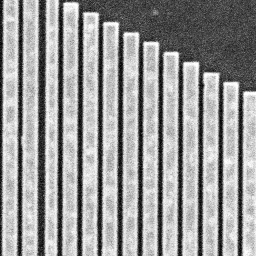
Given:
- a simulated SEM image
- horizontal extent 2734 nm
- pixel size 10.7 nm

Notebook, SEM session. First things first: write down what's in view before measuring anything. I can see parallel lines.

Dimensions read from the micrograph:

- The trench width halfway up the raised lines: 80.1 nm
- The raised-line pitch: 214 nanometres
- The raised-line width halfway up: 140 nm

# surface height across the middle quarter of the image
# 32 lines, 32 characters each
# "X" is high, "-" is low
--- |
XXX--XXX--XXX--XXX--XXX--XXX--XX
XXX--XXX--XXX--XXX--XXX--XXX--XX
XXX--XXX--XXX--XXX--XXX--XXX--XX
XXX--XXX--XXX--XXX--XXX--XXX--XX
XXX--XXX--XXX--XXX--XXX--XXX--XX
XXX--XXX--XXX--XXX--XXX--XXX--XX
XXX--XXX--XXX--XXX--XXX--XXX--XX
XXX--XXX--XXX--XXX--XXX--XXX--XX
XXX--XXX--XXX--XXX--XXX--XXX--XX
XXX--XXX--XXX--XXX--XXX--XXX--XX
XXX--XXX--XXX--XXX--XXX--XXX--XX
XXX--XXX--XXX--XXX--XXX--XXX--XX
XXX--XXX--XXX--XXX--XXX--XXX--XX
XXX--XXX--XXX--XXX--XXX--XXX--XX
XXX--XXX--XXX--XXX--XXX--XXX--XX
XXX--XXX--XXX--XXX--XXX--XXX--XX
XXX--XXX--XXX--XXX--XXX--XXX--XX
XXX--XXX--XXX--XXX--XXX--XXX--XX
XXX--XXX--XXX--XXX--XXX--XXX--XX
XXX--XXX--XXX--XXX--XXX--XXX--XX
XXX--XXX--XXX--XXX--XXX--XXX--XX
XXX--XXX--XXX--XXX--XXX--XXX--XX
XXX--XXX--XXX--XXX--XXX--XXX--XX
XXX--XXX--XXX--XXX--XXX--XXX--XX
XXX--XXX--XXX--XXX--XXX--XXX--XX
XXX--XXX--XXX--XXX--XXX--XXX--XX
XXX--XXX--XXX--XXX--XXX--XXX--XX
XXX--XXX--XXX--XXX--XXX--XXX--XX
XXX--XXX--XXX--XXX--XXX--XXX--XX
XXX--XXX--XXX--XXX--XXX--XXX--XX
XXX--XXX--XXX--XXX--XXX--XXX--XX
XXX--XXX--XXX--XXX--XXX--XXX--XX